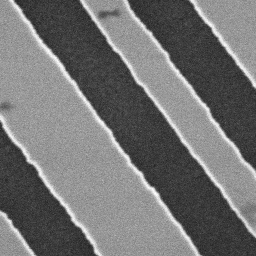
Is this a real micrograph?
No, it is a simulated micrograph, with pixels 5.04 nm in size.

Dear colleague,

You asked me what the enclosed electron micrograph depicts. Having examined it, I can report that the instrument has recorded lines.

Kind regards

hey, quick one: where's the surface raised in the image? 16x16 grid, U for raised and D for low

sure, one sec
UDDDDUUUDDDDUUUU
UUDDDDUUUDDDDUUU
UUUDDDDUUUDDDDUU
UUUDDDDUUUDDDDUU
UUUUDDDDUUUDDDDU
UUUUUDDDDUUUDDDD
UUUUUUDDDDUUUDDD
UUUUUUDDDDUUUDDD
DUUUUUUDDDDUUUDD
DUUUUUUUDDDDUUUD
DDUUUUUUUDDDDUUU
DDDUUUUUUDDDDUUU
DDDDUUUUUUDDDDUU
DDDDUUUUUUUDDDDU
UDDDDUUUUUUUDDDD
UUDDDDUUUUUUDDDD